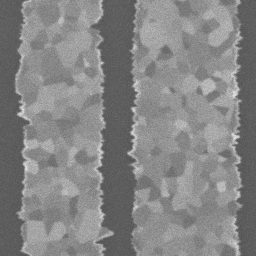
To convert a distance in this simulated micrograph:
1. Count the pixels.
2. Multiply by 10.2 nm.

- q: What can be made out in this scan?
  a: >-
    one or a few lines or trenches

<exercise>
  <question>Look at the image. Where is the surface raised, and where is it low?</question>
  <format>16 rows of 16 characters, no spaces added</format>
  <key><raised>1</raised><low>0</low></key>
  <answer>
0111110001111110
0111110011111110
0111110011111110
0111110011111110
0111110011111110
0111110011111110
0111110011111110
0011110011111110
0011110011111110
0111110011111110
0011110011111110
0111110001111110
0111110011111110
0111110011111110
0111111011111110
0011110011111110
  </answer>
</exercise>